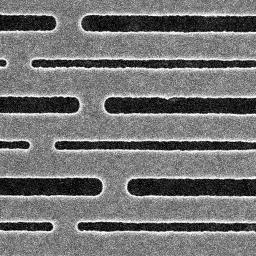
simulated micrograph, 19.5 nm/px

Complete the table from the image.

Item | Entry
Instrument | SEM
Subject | parallel lines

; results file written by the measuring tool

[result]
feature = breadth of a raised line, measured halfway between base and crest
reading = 534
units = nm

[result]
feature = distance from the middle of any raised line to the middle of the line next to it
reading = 798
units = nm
